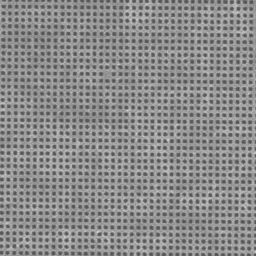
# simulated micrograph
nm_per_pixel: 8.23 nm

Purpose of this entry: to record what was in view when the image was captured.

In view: a regular array of holes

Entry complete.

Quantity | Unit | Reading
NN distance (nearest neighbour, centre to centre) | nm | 50.2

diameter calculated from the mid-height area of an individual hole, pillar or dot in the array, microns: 0.036